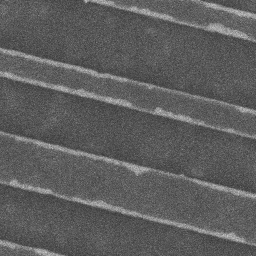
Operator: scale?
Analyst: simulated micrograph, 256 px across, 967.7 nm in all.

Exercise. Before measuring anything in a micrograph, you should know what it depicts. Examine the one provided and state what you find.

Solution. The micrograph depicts one or a few lines or trenches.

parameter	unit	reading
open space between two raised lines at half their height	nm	207